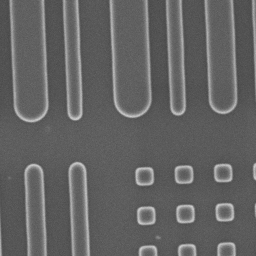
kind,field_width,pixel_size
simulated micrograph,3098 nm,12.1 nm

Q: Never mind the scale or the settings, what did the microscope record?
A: groups of lines, slits or small figures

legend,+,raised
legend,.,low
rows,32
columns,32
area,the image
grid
.++++...++....++++...++...+++...
.++++...++....++++...++...+++...
.++++...++....++++...++...+++...
.+++++..++....++++...++...+++...
.+++++..++....+++++..++...+++...
.+++++..++....+++++..++...+++...
..++++..++....+++++..++...+++...
..++++..++....+++++..++...+++...
..++++..++....+++++..++...+++...
..++++..++....+++++..++...+++...
..++++..++....+++++..++...++++..
..++++..++....+++++..++...++++..
..++++...+....+++++..++...++++..
..++++...+.....++++..++....++...
..+++....+......+...............
................................
................................
................................
................................
................................
.........+......................
...++....++......++...++...++...
...++....++......++...++...++...
...++....++.....................
...++....++.....................
...++....++.....................
...++....++......++...++...++...
...+++...++......++...++....+...
...+++...++.....................
...+++...++.....................
....++...++.................+...
....++...++.......++..++...++...